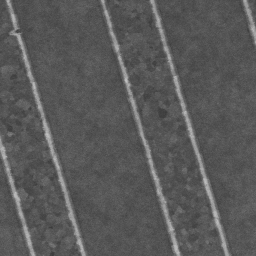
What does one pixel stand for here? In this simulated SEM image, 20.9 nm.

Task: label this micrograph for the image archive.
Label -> one or a few lines or trenches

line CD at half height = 0.989 micrometres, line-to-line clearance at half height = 1890 nanometers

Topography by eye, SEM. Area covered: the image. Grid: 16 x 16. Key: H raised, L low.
HLLLLLLHHHLLLLLH
HLLLLLLHHHLLLLLL
HLLLLLLHHHLLLLLL
HHLLLLLHHHHLLLLL
HHLLLLLLHHHLLLLL
HHLLLLLLHHHLLLLL
HHLLLLLLHHHLLLLL
HHHLLLLLLHHHLLLL
HHHLLLLLLHHHLLLL
HHHLLLLLLHHHLLLL
HHHHLLLLLLHHHLLL
LHHHLLLLLLHHHLLL
LHHHLLLLLLHHHLLL
LHHHHLLLLLHHHLLL
LLHHHLLLLLLHHHLL
LLHHHLLLLLLHHHLL